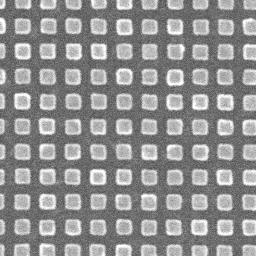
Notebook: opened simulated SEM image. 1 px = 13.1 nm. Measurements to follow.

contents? a regular array of raised bodies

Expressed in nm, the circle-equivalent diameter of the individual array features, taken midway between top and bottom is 205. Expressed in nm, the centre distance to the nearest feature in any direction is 326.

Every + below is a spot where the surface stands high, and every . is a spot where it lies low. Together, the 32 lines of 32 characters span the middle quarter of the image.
................................
..............++......+.........
.+++...+++...++++...+++...++++..
.+++...+++...++++...+++...++++..
.+++...+++...++++...+++...++++..
................................
................................
................................
.+++...+++...++++...+++...+++...
.+++...+++...++++...+++...+++...
.+++...+++...++++...+++...+++...
................................
................................
................................
.+++...+++...++++...+++...+++...
.+++...+++...++++...+++...++++..
.+++...+++...++++...+++...+++...
.+..............................
................................
................................
.+++...+++...+++....+++.........
.+++...+++...++++...+++...+++...
++++...+++...++++...+++...+++...
.+++...+++....++....+++...+++...
................................
................................
................................
++++...+++...++++...+++...+++...
++++...+++...++++...+++...+++...
.+++...+++...++++...+++...+++...
................................
................................